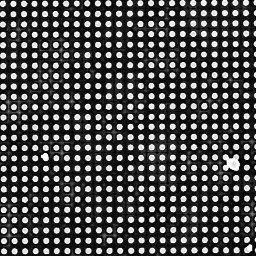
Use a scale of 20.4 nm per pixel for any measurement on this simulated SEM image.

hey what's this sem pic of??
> a regular array of raised bodies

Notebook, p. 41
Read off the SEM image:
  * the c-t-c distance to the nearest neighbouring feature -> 207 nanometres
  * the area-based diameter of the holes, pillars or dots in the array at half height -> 115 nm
